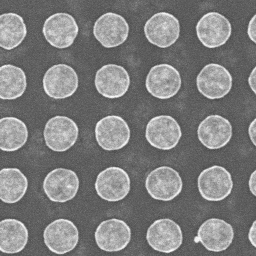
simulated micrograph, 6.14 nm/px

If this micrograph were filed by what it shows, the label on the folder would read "a regular array of raised bodies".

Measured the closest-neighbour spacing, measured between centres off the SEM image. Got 51 pixels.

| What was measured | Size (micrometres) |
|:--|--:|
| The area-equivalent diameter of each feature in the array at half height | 0.207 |